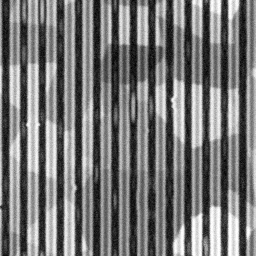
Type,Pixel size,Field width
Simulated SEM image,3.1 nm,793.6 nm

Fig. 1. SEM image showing parallel lines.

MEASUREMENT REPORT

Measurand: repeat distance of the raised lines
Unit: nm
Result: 56.4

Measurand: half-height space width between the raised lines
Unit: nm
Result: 31.4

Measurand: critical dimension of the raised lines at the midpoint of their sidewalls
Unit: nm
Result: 22.8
